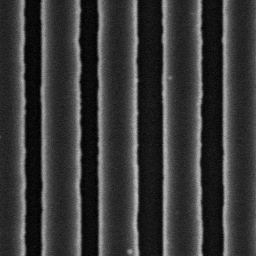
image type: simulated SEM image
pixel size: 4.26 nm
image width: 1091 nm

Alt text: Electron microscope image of lines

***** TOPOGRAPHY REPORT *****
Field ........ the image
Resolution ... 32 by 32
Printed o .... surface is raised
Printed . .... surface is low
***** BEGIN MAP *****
ooo..ooooo..ooooo...ooooo...oooo
ooo..ooooo..ooooo...ooooo...oooo
ooo..ooooo..ooooo...ooooo...oooo
ooo..ooooo..ooooo...ooooo...oooo
ooo..ooooo..ooooo...ooooo...oooo
ooo..ooooo..ooooo...ooooo...oooo
ooo..ooooo..ooooo...ooooo...oooo
ooo..ooooo..ooooo...ooooo...oooo
ooo..ooooo..ooooo...ooooo...oooo
ooo..ooooo..ooooo...ooooo...oooo
ooo..ooooo..ooooo...ooooo...oooo
ooo..ooooo..ooooo...ooooo...oooo
ooo..ooooo..ooooo...ooooo...oooo
ooo..ooooo..ooooo....oooo...oooo
ooo..ooooo..ooooo...ooooo...oooo
ooo..ooooo..ooooo...ooooo...oooo
ooo..ooooo..ooooo....oooo...oooo
ooo..ooooo..ooooo....oooo...oooo
ooo..ooooo..ooooo....oooo...oooo
ooo..ooooo..ooooo....oooo...oooo
ooo..ooooo..ooooo....oooo...oooo
ooo..ooooo..ooooo....oooo...oooo
ooo..ooooo..ooooo....oooo...oooo
ooo..ooooo..ooooo....oooo...oooo
ooo..ooooo..ooooo....oooo...oooo
ooo..ooooo..ooooo....oooo...oooo
ooo..ooooo..ooooo....oooo...oooo
ooo..ooooo..ooooo...ooooo...oooo
ooo..ooooo..ooooo...ooooo...oooo
ooo..ooooo..ooooo...ooooo...oooo
ooo..ooooo..ooooo....oooo...oooo
ooo..ooooo..ooooo....oooo...oooo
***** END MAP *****